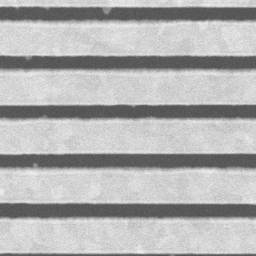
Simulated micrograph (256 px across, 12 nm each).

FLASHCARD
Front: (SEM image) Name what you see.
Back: lines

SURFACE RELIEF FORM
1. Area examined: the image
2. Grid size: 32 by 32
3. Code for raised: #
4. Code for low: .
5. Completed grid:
################################
................................
................................
################################
################################
################################
################################
................................
................................
################################
################################
################################
################################
................................
................................
################################
################################
################################
################################
................................
................................
################################
################################
################################
################################
................................
................................
################################
################################
################################
################################
################################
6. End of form